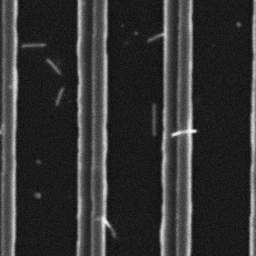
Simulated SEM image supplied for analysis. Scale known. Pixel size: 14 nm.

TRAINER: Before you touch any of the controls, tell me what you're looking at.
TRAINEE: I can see lines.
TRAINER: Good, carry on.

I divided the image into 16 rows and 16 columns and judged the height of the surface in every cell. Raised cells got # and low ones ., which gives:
#....##...##....
#....##...##....
#....##...##....
#....##...##....
#....##...##....
#....##...##....
#....##...##....
#....##...##....
#....##...##....
#....##...##....
#....##...##....
#....##...##....
#....##...##....
#....##...##....
#....#....##....
#....#....##....